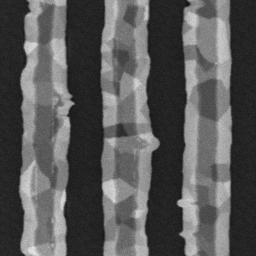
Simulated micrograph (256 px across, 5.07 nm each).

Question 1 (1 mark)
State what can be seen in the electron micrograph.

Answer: one or a few lines or trenches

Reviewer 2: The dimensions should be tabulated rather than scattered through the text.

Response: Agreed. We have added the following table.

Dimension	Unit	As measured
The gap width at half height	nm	253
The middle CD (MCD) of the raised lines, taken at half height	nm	160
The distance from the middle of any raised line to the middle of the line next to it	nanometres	410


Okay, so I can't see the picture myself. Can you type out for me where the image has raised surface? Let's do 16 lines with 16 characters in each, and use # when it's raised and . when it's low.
..##...##...##..
..##...##...##..
..##...##...##..
..##...##...##..
..##...##...##..
..##...##...##..
..##...##...##..
..##...##...##..
..##...##...##..
..##...##...##..
..##...##...##..
..##...##...##..
..##...##...##..
..##...##...##..
..##...##...##..
..##...##...##..